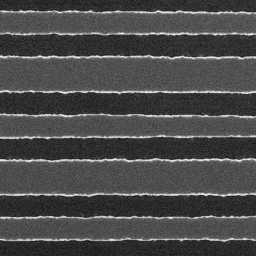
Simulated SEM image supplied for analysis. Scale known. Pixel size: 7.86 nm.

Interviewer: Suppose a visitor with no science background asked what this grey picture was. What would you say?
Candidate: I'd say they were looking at lines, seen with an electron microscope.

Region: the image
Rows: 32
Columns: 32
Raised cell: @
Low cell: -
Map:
--------------------------------
@-@@@-@-@@----@@---@--@---------
@@@@@@@@@@@@@@@@@@@@@@@@@@@@@@@@
@@@@@@@@@@@@@@@@@@@@@@@@@@@@@@@@
--------------------------------
--------------------------------
--------------------------------
@@@@@@@@@@@@@@@@@@@@@@@@@@@@@@@@
@@@@@@@@@@@@@@@@@@@@@@@@@@@@@@@@
@@@@@@@@@@@@@@@@@@@@@@@@@@@@@@@@
@@@@@@@@@@@@@@@@@@@@@@@@@@@@@@@@
@@@-@@@@@@@@@@@@@@@@@@@@@@@@@@@@
--------------------------------
--------------------------------
@@@@@@@@@@@@@@@@@@@@@@@@@@-@@@--
@@@@@@@@@@@@@@@@@@@@@@@@@@@@@@@@
@@@@@@@@@@@@@@@@@@@@@@@@@@@@@@@@
--------------------------------
--------------------------------
--------------------------------
@@@@@@@@@@@@@@@@@@@@@@@@@@@@@@@@
@@@@@@@@@@@@@@@@@@@@@@@@@@@@@@@@
@@@@@@@@@@@@@@@@@@@@@@@@@@@@@@@@
@@@@@@@@@@@@@@@@@@@@@@@@@@@@@@@@
--------------------------------
--------------------------------
--------------------------------
@@@@@@@@@@@@@@@@@@@@@@@@@@@@@@@@
@@@@@@@@@@@@@@@@@@@@@@@@@@@@@@@@
@@@@@@@@@@@@@@@@@@@@@@@@@@@@@@@@
--------------------------------
--------------------------------